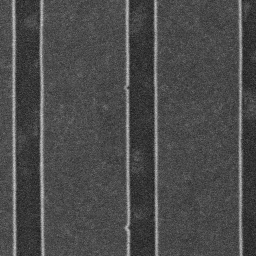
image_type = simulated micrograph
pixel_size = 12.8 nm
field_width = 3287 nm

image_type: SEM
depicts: one or a few lines or trenches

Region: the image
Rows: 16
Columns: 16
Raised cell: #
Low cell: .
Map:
#..#####..#####.
#..#####..#####.
#..#####..#####.
#..#####..#####.
#..#####..#####.
#..#####..#####.
#..#####..#####.
#..#####..#####.
#..#####..#####.
#..#####..#####.
#..#####..#####.
#..#####..#####.
#..#####..#####.
#..#####..#####.
#..#####..#####.
#..#####..#####.